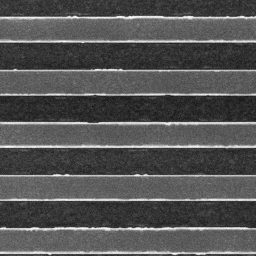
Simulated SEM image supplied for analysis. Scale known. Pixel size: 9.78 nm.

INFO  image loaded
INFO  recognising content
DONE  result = lines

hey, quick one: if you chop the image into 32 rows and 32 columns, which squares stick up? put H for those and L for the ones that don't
LLLLLLLLLLLLLLLLLLLLLLLLLLLLLLLL
LLLLLLLLLLLLLLLLLLLLLLLLLLLLLLLL
HHHHHHHHHHHHHHHHHHHHHHHHHHHHHHHH
HHHHHHHHHHHHHHHHHHHHHHHHHHHHHHHH
HHHHHHHHHHHHHHHHHHHHHHHHHHHHHHHH
LLLLLLLLLLLLLLLLLLLLLLLLLLLLLLLL
LLLLLLLLLLLLLLLLLLLLLLLLLLLLLLLL
LLLLLLLLLLLLLLLLLLLLLLLLLLLLLLLL
LLLLLLLLLLLLLLLLLLLLLLLLLLLLLLLL
HHHHHHHHHHHHHHHHHHHHHHHHHHHHHHHH
HHHHHHHHHHHHHHHHHHHHHHHHHHHHHHHH
HHHHHHHHHHHHHHHHHHHHHHHHHHHHHHHH
LLLLLLLLLLLLLLLLLLLLLLLLLLLLLLLL
LLLLLLLLLLLLLLLLLLLLLLLLLLLLLLLL
LLLLLLLLLLLLLLLLLLLLLLLLLLLLLLLL
HHHHHHHHHHHHHHHHHHHHHHHHHHHHHHHH
HHHHHHHHHHHHHHHHHHHHHHHHHHHHHHHH
HHHHHHHHHHHHHHHHHHHHHHHHHHHHHHHH
LLLLLLLLLLLLLLLLLLLLLLLLLLLLLLLL
LLLLLLLLLLLLLLLLLLLLLLLLLLLLLLLL
LLLLLLLLLLLLLLLLLLLLLLLLLLLLLLLL
LLLLLLLLLLLLLLLLLLLLLLLLLLLLLLLL
HHHHHHHHHHHHHHHHHHHHHHHHHHHHHHHH
HHHHHHHHHHHHHHHHHHHHHHHHHHHHHHHH
HHHHHHHHHHHHHHHHHHHHHHHHHHHHHHHH
LLLLLLLLLLLLLLLLLLLLLLLLLLLLLLLL
LLLLLLLLLLLLLLLLLLLLLLLLLLLLLLLL
LLLLLLLLLLLLLLLLLLLLLLLLLLLLLLLL
LLLLLLLLLLLLLLLLLLLLLLLLLLLLLLLL
HHHHHHHHHHHHHHHHHHHHHHHHHHHHHHHH
HHHHHHHHHHHHHHHHHHHHHHHHHHHHHHHH
HHHHHHHHHHHHHHHHHHHHHHHHHHHHHHHH